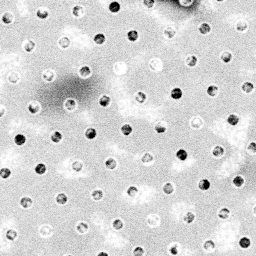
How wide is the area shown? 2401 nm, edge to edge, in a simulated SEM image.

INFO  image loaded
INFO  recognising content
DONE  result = a regular array of holes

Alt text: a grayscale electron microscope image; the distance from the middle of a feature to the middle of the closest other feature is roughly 0.327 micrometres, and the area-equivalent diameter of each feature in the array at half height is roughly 11.9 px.